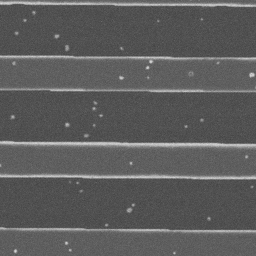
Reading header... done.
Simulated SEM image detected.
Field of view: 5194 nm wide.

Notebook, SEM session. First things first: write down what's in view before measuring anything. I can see lines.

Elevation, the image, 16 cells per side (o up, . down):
................
................
................
................
oooooooooooooooo
oooooooooooooooo
................
................
................
oooooooooooooooo
oooooooooooooooo
................
................
................
oooooooooooooooo
oooooooooooooooo